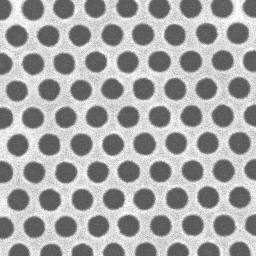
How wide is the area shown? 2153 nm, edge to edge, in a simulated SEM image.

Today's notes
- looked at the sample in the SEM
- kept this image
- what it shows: a regular array of holes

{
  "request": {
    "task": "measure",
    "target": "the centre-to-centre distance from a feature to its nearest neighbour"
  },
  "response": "260 nm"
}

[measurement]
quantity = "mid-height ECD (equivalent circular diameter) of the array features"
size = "0.188 um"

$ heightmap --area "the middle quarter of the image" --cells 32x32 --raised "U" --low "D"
DDDUUDDDDDDUUDDDDDDUUDDDDDDUUDDD
DDUUUUDDDDUUUUDDDDUUUUDDDDUUUUDD
DUUUUUUUUUUUUUUUUUUUUUUUUUUUUUUU
UUUUUUUUUUUDUUUUUUUDUUUUUUUDDUUU
UUDDDDUUUUDDDDUUUDDDDDUUUUDDDDUU
UUDDDDDUUDDDDDDUUDDDDDDUUDDDDDUU
UDDDDDDUUDDDDDDUUDDDDDDUUDDDDDDU
UUDDDDDUUUDDDDDUUDDDDDUUUDDDDDUU
UUDDDDUUUUDDDDUUUUDDDDUUUUDDDDUU
UUUUUUUUUUUUUUUUUUUUUUUUUUUUUUUU
UUUUUUUDDUUUUUUUDUUUUUUUDUUUUUUD
DDDUUUDDDDUUUUDDDDUUUUDDDDUUUUDD
DDDUUDDDDDDUUDDDDDDUUDDDDDDUUDDD
DDDUUDDDDDDUUDDDDDDUUDDDDDDUUDDD
DDDUUUDDDDDUUDDDDDDUUDDDDDUUUDDD
DDUUUUUDDDUUUUDDDDUUUUDDDDUUUUUD
UUUUUUUUUUUUUUUUUUUUUUUUUUUUUUUU
UUUDDUUUUUUUDUUUUUUDDDUUUUDDDDUU
UUDDDDDUUUDDDDUUUUDDDDDUUUDDDDDU
UDDDDDDUUUDDDDDUUDDDDDDUUDDDDDDU
UDDDDDDUUDDDDDDUUDDDDDDUUDDDDDDU
UUDDDDDUUUDDDDDUUUDDDDDUUUDDDDUU
UUUDDDUUUUUDDDUUUUUDDDUUUUUDDUUU
UUUUUUUUUUUUUUUUUUUUUUUUUUUUUUUU
DUUUUUUDDUUUUUUDDDUUUUUDDUUUUUDD
DDDUUUDDDDDUUUDDDDDUUUDDDDDUUUDD
DDDUUUDDDDDUUDDDDDDUUDDDDDDUUDDD
DDDUUUDDDDDUUDDDDDDUUDDDDDDUUUDD
DDDUUUDDDDDUUUDDDDDUUUDDDDUUUUDD
DDUUUUUDDDUUUUUDDUUUUUUDDUUUUUUU
UUUUUUUUUUUUUUUUUUUUUUUUUUUUUUUU
UUUDDDUUUUUDDDUUUUUDDDUUUUDDDDUU